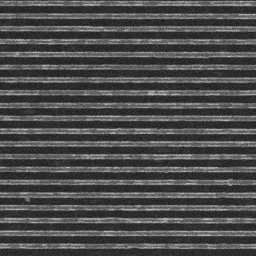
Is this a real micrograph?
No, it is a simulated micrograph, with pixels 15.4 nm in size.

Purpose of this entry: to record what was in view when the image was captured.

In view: parallel lines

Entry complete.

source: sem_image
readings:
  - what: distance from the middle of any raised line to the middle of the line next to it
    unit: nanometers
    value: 197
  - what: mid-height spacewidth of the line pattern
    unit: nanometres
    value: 123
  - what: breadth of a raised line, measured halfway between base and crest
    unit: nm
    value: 67.3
